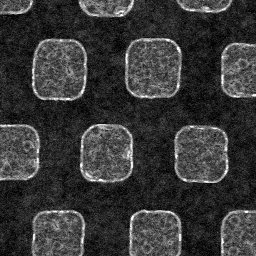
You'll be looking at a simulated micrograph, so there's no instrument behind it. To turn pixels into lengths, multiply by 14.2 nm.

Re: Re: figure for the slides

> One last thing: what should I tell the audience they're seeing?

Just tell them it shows raised bodies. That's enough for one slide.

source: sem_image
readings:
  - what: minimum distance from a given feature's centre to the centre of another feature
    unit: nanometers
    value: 1350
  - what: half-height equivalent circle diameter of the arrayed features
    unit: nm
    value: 845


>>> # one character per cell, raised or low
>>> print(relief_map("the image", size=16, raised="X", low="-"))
XX---XXX----XX--
----------------
---------X------
--XXX---XXX---XX
--XXX---XXX---XX
--XXX---XXX---XX
----------------
----------------
XX---XXX---XXX--
XX---XXX---XXX--
XX---XXX---XXX--
----------------
----------------
--XXX---XXX---XX
--XXX---XXX---XX
--XXX---XXX---XX